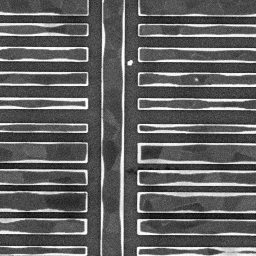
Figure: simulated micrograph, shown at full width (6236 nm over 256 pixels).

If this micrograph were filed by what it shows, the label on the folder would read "groups of lines, slits or small figures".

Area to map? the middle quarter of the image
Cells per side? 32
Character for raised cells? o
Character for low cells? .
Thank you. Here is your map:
..........ooooo.................
..........ooooo.................
oooooo....ooooo....ooooo.......o
oooooo....ooooo....ooooooooooooo
oooooo....ooooo....ooooooooooooo
..........ooooo.................
..........ooooo.................
..........ooooo.................
..........ooooo.................
oooooo....ooooo....ooooooooooooo
oooooo....ooooo....ooooooooooooo
..........ooooo.................
..........ooooo.................
..........ooooo.................
..........ooooo.................
oooooo....ooooo....ooooo.ooooooo
oooooo....ooooo....ooooooooooooo
..........ooooo.................
..........ooooo.................
..........ooooo.................
oooooo....ooooo....ooooooooooooo
oooooo....ooooo....ooooooooooooo
oooooo....ooooo....ooooooooooooo
oooooo....oooo.....ooooooooooooo
..........oooo.............ooooo
..........oooo..................
..........oooo..................
oooooo....oooo.....ooooooooooooo
oooooo....oooo.....ooooooooooooo
oooooo....oooo.....ooooooooooooo
..........oooo..................
.........ooooo..................